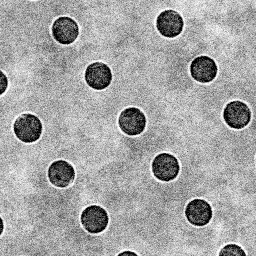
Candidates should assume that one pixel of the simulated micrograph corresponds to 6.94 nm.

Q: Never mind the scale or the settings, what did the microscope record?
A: a regular array of holes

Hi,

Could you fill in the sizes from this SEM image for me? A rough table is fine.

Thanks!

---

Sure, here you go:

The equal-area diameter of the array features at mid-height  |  29.1 px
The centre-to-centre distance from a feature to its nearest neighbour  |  391 nm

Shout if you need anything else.